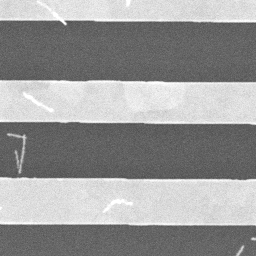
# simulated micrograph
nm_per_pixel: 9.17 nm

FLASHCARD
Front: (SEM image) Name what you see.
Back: lines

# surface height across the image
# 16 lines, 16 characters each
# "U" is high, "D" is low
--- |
UUUUUUUUUUUUUUUU
DDDDDDDDDDDDDDDD
DDDDDDDDDDDDDDDD
DDDDDDDDDDDDDDDD
DDDDDDDDDDDDDDDD
UUUUUUUUUUUUUUUU
UUUUUUUUUUUUUUUU
UUUUUUUUUUUUUUUU
DDDDDDDDDDDDDDDD
DDDDDDDDDDDDDDDD
DDDDDDDDDDDDDDDD
UUUUUUUUUUUUUUUU
UUUUUUUUUUUUUUUU
UUUUUUUUUUUUUUUU
DDDDDDDDDDDDDDDD
DDDDDDDDDDDDDDDD